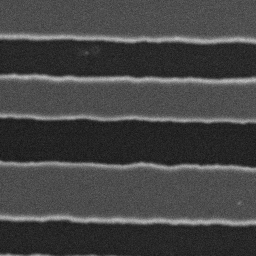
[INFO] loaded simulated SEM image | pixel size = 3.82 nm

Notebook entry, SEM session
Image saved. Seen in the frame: lines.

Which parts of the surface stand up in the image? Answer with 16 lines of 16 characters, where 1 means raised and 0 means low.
1111111111111111
1111111111111111
0000000111111111
0000000000000000
0000000000000000
1111111111111111
1111111111111111
0000000000111111
0000000000000000
0000000000000000
1111111111111111
1111111111111111
1111111111111111
1111111111111111
0000000000000000
0000000000000000